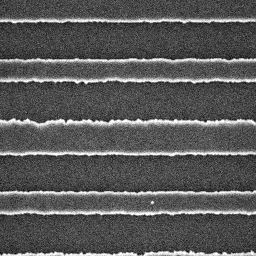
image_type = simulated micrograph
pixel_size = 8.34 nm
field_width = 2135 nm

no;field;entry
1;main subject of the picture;lines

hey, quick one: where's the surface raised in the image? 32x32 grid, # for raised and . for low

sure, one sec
################################
################################
################################
................................
................................
................................
................................
..#.#....#......#####..##.##.###
################################
################################
................................
................................
................................
................................
................................
################################
################################
################################
################################
................................
................................
................................
................................
................................
################################
################################
################################
................................
................................
................................
................................
................................